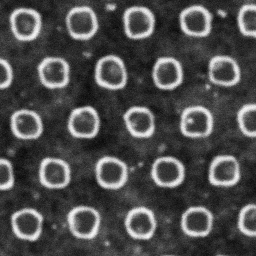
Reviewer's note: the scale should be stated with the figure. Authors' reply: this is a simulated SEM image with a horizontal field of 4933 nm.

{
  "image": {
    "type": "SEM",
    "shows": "a regular array of raised bodies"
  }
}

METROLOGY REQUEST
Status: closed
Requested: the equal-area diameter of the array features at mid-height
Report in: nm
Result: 550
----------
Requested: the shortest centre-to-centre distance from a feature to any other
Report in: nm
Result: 1080